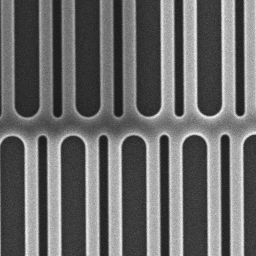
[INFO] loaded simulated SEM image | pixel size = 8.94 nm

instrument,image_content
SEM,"groups of lines, slits or small figures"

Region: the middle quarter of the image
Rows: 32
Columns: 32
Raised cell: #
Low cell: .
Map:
###......###...###......###...##
###......###...###......###...##
###......###...###.......##...##
###......###...###.......##...##
###......###...###.......##...##
###......###...###.......##...##
###......###...###.......###..##
###......###...###.......###..##
###......###...###.......###..##
###......###...###.......###..##
###......###...###......####..##
###......###...###......####..##
####....####...####....#####..##
################################
################################
################################
################################
################################
....#####..####.....####..####..
.....####..####.....####..####..
......###..###.......###..###...
......###..###.......###..###...
......###..###.......###..###...
......###..###.......###..###...
......###..###.......###..###...
......###..###.......###..###...
......###..###.......###..###...
......###..###.......###..###...
......###..###.......###..###...
......###..###.......###..###...
......###..###.......###..###...
......###..###.......###..###...